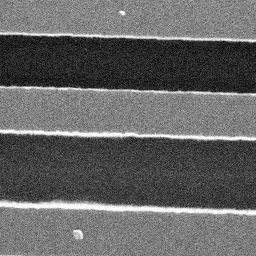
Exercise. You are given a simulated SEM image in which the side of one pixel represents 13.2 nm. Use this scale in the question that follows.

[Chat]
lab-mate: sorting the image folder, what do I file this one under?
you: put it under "lines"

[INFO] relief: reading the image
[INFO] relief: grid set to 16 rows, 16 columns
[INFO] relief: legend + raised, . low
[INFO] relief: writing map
++++++++++++++++
++++++++++++++++
...............+
................
................
+++.............
++++++++++++++++
++++++++++++++++
............++++
................
................
................
................
++++++++++++++++
++++++++++++++++
++++++++++++++++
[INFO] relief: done